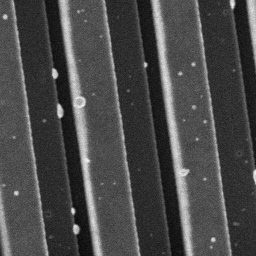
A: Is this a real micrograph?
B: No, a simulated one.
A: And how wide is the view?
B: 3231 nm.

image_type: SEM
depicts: lines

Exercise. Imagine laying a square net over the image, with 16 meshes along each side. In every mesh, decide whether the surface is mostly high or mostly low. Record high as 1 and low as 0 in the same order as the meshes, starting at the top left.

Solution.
1000111000110000
1000111000111000
1000111000111000
1000111000111000
1000111000111000
1100111000111000
1100011000111000
1100011100011000
1100011100011000
1100011100011100
1100011100011100
1100011100011100
1110011100011100
1110001100011100
1110001110011100
1110001110001100